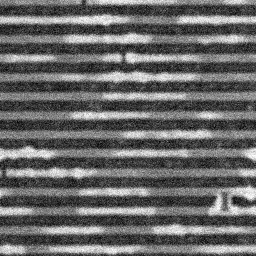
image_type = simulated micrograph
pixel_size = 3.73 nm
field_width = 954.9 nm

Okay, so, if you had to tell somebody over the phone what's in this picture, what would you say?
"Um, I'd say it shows parallel lines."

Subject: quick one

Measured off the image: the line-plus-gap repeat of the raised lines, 71.2 nanometres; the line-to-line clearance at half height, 12.4 pixels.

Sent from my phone